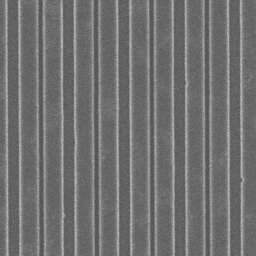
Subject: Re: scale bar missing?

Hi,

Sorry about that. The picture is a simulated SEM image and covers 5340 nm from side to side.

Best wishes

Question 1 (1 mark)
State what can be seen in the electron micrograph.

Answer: parallel lines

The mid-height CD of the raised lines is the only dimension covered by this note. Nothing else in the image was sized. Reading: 381 nanometres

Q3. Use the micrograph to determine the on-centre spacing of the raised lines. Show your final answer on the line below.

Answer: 0.568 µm